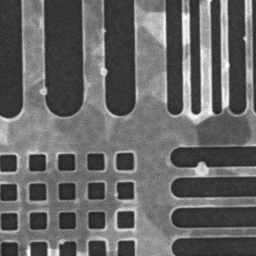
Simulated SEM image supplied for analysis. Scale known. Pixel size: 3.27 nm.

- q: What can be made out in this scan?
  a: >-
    groups of lines, slits or small figures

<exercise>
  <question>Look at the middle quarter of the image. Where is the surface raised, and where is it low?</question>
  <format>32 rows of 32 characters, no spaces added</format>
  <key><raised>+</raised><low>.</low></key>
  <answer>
.....+++++........+++++++.....+.
.....+++++........+++++++.....+.
.....++++++.......+++++++.....+.
.....+++++........+++++++.....+.
.....+++++........+++++++.....+.
......++++........+++++++.....+.
......++++........+++++++.....++
.....+++++........+++++++.....++
.....+++++........+++++++.....++
.....+++++........++++++++....++
.....+++++........++++++++....++
....+++++++......+++++++++....++
...+++++++++....+++++++++++..+++
++++++++++++++++++++++++++++++++
++++++++++++++++++++++++++++++++
++++++++++++++++++++++++++++++++
++++++++++++++++++++++++++++++++
+++++++++++++++++++++++++.+.++++
++++++++++++++++++++++++++++.+++
++++++++++++++++++++++++++++++++
++++++++++++++++++++++++++++++++
+++++++++++++++++++++++++++.....
...+++....+++.....+++++++++.....
...+++....+++.....++++++++......
...+++.....+......+++++++++.....
...+++.....++.....++++++++++....
...+++....+++.....++++++++++++++
++++++++++++++++++++++++++++++++
++++++++++++++++++++++++++++....
++++++++..++++...++++++++++.....
...+++.....++.....+++++++++.....
...+++....+++.....+++++++++.....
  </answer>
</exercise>